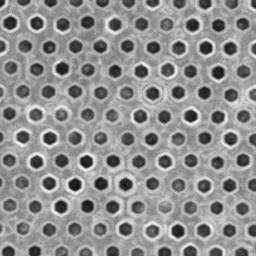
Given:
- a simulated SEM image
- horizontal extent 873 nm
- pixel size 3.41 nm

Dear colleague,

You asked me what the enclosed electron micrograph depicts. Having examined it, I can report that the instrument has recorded a regular array of holes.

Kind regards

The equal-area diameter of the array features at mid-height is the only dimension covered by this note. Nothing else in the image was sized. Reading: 48.9 nm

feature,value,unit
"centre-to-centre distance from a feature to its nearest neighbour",85.3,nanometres